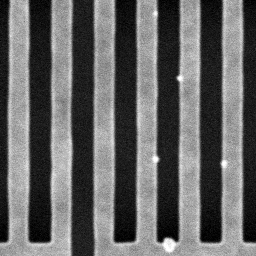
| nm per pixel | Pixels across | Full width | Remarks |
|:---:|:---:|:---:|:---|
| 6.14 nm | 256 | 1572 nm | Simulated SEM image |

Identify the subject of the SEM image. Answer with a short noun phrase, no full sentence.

groups of lines, slits or small figures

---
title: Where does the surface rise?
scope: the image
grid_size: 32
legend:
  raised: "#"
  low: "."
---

.###...##...##...###...##...##..
.###...##...##...###...##...##..
.###...##...##...###...##...##..
.###...##...##...###...##...##..
.###..###...##...###...##...##..
.###...##...##...###...##...##..
.###...##...##...###...##...##..
.###...##...##...##....##...##..
.###...##...##...##....##...##..
.###..###...##...###..###...##..
.###..###...##...###..###...##..
.###..###...##...###...##...##..
.###...##...##...###...##...##..
.###...##...##...##....##...##..
.###...##...##...##....##...##..
.###...##...##...##....##...##..
.###..###...##...##....##...##..
.###..###...##...##....##...##..
.###..###...##...##....##...##..
.###..###...##...###...##...##..
.###...##...##...###...##...##..
.###..###...##...###...##...##..
.###..###...##...###...##...##..
.###..###...##...###...##...##..
.###..###...##...###...##...##..
.###..###...##...##....##...##..
.###...##...##...##....##...##..
.##....##...##...##....##...##..
.##...###...##...##....##...##..
.###..###...##...##...###...##..
#########...####################
#########...####################